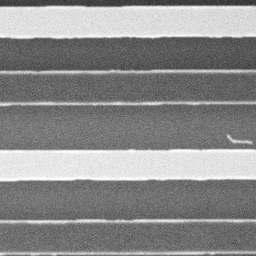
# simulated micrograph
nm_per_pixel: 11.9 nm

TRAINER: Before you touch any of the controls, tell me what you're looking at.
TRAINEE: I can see lines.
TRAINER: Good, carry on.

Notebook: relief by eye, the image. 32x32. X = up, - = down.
--------------------------------
XXXXXXXXXXXXXXXXXXXXXXXXXXXXXXXX
XXXXXXXXXXXXXXXXXXXXXXXXXXXXXXXX
XXXXXXXXXXXXXXXXXXXXXXXXXXXXXXXX
XXXXXXXXXXXXXXX--XXX-------X-X--
--------------------------------
--------------------------------
--------------------------------
--------------------------------
XXXXXXXXXXXXXXXXXXXXXXXXXXXXXXXX
XXXXXXXXXXXXXXXXXXXXXXXXXXXXXXXX
XXXXXXXXXXXXXXXXXXXXXXXXXXXXXXXX
XXXXXXXXXXXXXXXXXXXXXXXXXXXXXXXX
--------------------------------
--------------------------------
--------------------------------
--------------------------------
--------------------------------
--------------------------------
XXXXXXXXXXXXXXXXXXXXXXXXXXXXXXXX
XXXXXXXXXXXXXXXXXXXXXXXXXXXXXXXX
XXXXXXXXXXXXXXXXXXXXXXXXXXXXXXXX
XX------------------------------
--------------------------------
--------------------------------
--------------------------------
--------------------------------
--------------------------------
XXXXXXXXXXXXXXXXXXXXXXXXXXXXXXXX
XXXXXXXXXXXXXXXXXXXXXXXXXXXXXXXX
XXXXXXXXXXXXXXXXXXXXXXXXXXXXXXXX
XXXXXXXXXXXXXXXXXXXXXXXXXXXXXXXX